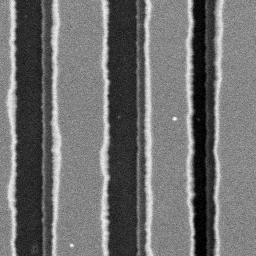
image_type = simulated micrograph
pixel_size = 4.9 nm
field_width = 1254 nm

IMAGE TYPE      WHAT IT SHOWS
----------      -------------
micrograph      lines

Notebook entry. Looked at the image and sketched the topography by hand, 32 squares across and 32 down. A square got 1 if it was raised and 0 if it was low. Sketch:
11000001111110000011111100011111
11000001111110000011111100011111
11000001111110000011111100011111
11000001111110000011111100011111
11000001111110000011111100011111
11000001111110000011111100011111
11000001111110000011111100011111
11000001111110000011111100011111
11000001111110000011111100011111
11000001111110000011111100011111
11000001111111000011111100011111
11000001111110000011111100011111
11000001111110000011111100011111
11000001111110000011111100011111
11000001111110000011111100011111
11000001111111000011111100011111
11000001111110000011111100011111
11000001111111000011111100011111
11000001111110000011111100011111
11000001111110000011111100011111
11000001111110000011111100011111
11000001111110000011111100011111
11000001111111000011111100011111
11000001111110000011111100011111
11000001111110000011111100011111
11000001111110000011111100011111
11000001111110000011111100011111
11000001111110000011111100011111
11000001111110000011111100011111
11000001111110000011111100011111
11000001111110000011111100011111
11000001111110000011111100011111